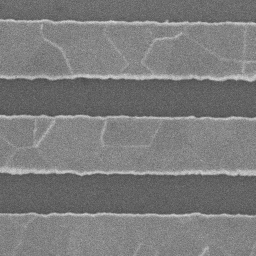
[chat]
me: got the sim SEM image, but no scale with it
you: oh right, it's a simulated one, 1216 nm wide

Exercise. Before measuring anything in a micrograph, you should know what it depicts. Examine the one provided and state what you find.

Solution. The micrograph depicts lines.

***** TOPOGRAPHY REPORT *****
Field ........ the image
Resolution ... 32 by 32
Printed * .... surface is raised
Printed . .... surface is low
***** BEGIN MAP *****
................................
................................
**...*..........................
********************************
********************************
********************************
********************************
********************************
********************************
********************************
................................
................................
................................
................................
****.*...**.....................
********************************
********************************
********************************
********************************
********************************
********************************
********************************
................................
................................
................................
................................
................................
********************************
********************************
********************************
********************************
********************************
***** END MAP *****